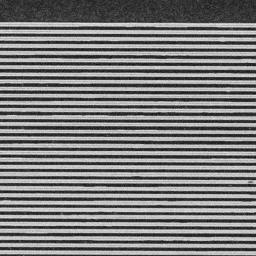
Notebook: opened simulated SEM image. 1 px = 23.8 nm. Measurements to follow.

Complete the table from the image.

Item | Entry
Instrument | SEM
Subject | parallel lines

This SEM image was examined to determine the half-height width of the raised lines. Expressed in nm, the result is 59.4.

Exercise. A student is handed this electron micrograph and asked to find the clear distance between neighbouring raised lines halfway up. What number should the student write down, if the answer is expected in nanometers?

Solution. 119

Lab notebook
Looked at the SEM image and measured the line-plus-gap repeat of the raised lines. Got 169 nanometers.